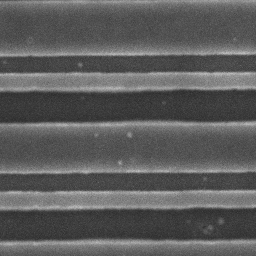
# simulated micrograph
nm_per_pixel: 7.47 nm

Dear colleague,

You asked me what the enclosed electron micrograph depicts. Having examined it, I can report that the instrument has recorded lines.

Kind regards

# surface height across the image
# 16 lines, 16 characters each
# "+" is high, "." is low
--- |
++++++++++++++++
++++++++++++++++
++++++++++++++++
++++++++++++++++
++++++++++++++++
+++++++++++.+++.
................
................
++++++++++++++++
++++++++++++++++
++++++++++++++++
++++++++++++++++
++++++++++++++++
................
................
++++++++++++++++